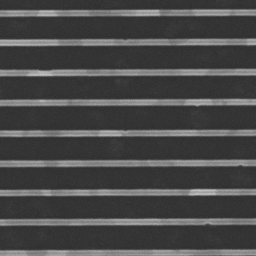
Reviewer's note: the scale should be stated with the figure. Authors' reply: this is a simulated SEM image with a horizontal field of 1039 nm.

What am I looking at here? parallel lines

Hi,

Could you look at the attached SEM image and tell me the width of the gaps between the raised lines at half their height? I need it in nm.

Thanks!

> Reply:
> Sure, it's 100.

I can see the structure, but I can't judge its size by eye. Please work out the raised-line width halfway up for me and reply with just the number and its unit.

19.8 nm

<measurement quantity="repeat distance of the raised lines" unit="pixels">30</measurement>